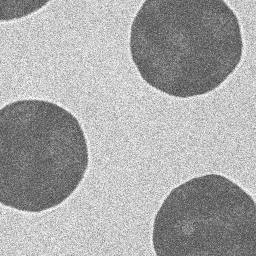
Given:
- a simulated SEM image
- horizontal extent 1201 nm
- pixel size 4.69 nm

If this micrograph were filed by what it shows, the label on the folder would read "holes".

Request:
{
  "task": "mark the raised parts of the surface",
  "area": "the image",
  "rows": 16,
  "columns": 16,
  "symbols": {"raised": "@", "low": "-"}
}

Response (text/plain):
---@@@@@@-----@@
@@@@@@@@-------@
@@@@@@@@-------@
@@@@@@@@-------@
@@@@@@@@@-----@@
@@@@@@@@@@---@@@
@--@@@@@@@@@@@@@
-----@@@@@@@@@@@
-----@@@@@@@@@@@
-----@@@@@@@@@@@
-----@@@@@@@@@@@
-----@@@@@@----@
----@@@@@@------
@@@@@@@@@@------
@@@@@@@@@@------
@@@@@@@@@@------